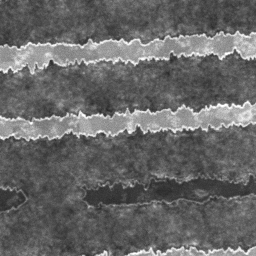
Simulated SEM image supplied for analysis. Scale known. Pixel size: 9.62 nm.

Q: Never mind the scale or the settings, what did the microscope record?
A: one or a few lines or trenches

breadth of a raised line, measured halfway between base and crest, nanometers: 192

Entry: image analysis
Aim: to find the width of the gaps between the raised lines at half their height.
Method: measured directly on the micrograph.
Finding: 489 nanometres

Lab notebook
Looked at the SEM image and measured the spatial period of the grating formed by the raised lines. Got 691 nm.